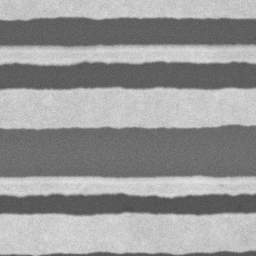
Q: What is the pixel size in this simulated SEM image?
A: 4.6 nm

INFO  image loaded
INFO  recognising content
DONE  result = lines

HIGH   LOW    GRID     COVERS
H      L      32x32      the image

HHHHHHHHHHHHHHHHHHHHHHHHHHHHHHHH
HHHHHHHHHHHHHHHHHHHHHHHHHHHHHHHH
LLLLLLLLLLLLLLLLLLLLLLLLLLLLLLLL
LLLLLLLLLLLLLLLLLLLLLLLLLLLLLLLL
LLLLLLLLLLLLLLLLLLLLLLLLLLLLLLLL
LLLLLLLLLLLLLLLLLLLLLLLLLLLLLLLL
HHHHHHHHHHHHHHHHHHHHHHHHHHHHHHHH
HHHHHHHHHHHHHHHHHHHHHHHHHHHHHHHH
LLLLLLLLLLLLLLLLLLLLLLLLLLLLLLLL
LLLLLLLLLLLLLLLLLLLLLLLLLLLLLLLL
LLLLLLLLLLLLLLLLLLLLLLLLLLLLLLLL
HHHHHHHHHHHHHHHHHHHHHHHHHHHHHHHH
HHHHHHHHHHHHHHHHHHHHHHHHHHHHHHHH
HHHHHHHHHHHHHHHHHHHHHHHHHHHHHHHH
HHHHHHHHHHHHHHHHHHHHHHHHHHHHHHHH
HHHHHHHHHHHHHHHHHHHHHHHHHHHHHLHH
LLLLLLLLLLLLLLLLLLLLLLLLLLLLLLLL
LLLLLLLLLLLLLLLLLLLLLLLLLLLLLLLL
LLLLLLLLLLLLLLLLLLLLLLLLLLLLLLLL
LLLLLLLLLLLLLLLLLLLLLLLLLLLLLLLL
LLLLLLLLLLLLLLLLLLLLLLLLLLLLLLLL
LLLLLLLLLLLLLLLLLLLLLLLLLLLLLLLL
HHHHHHHHHHHHHHHLHHHHHHHHHHHHHHHH
HHHHHHHHHHHHHHHHHHHHHHHHHHHHHHHH
LLHLLLLLLLLLLLLLLLLLHHHLLLLLLLLL
LLLLLLLLLLLLLLLLLLLLLLLLLLLLLLLL
LLLLLLLLLLLLLLLLLLLLLLLLLLLLLLLL
HHHHHHHHHHHHHHHHHHHHHHHHHHHHHHHH
HHHHHHHHHHHHHHHHHHHHHHHHHHHHHHHH
HHHHHHHHHHHHHHHHHHHHHHHHHHHHHHHH
HHHHHHHHHHHHHHHHHHHHHHHHHHHHHHHH
HHHHHHHHHHHHLHHHHHHHHHHHHHHLLLLL